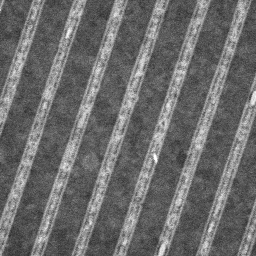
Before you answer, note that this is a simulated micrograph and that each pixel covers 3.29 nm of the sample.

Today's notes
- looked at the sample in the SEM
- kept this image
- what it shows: parallel lines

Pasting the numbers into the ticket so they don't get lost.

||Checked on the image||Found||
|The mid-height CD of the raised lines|96.3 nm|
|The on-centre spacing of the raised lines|39.1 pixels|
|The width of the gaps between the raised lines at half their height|32.3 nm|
